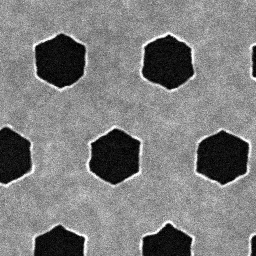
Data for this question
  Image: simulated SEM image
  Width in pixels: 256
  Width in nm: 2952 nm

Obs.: holes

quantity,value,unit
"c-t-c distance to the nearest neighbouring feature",1240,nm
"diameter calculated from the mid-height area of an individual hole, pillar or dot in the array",607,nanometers